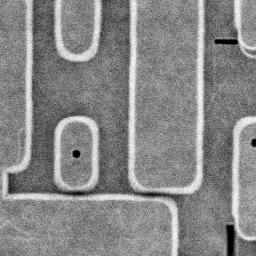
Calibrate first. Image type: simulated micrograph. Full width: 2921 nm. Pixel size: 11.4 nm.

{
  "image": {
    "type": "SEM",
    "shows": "wiring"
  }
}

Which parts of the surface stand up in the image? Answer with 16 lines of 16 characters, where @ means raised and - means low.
@@--@@--@@@@@--@
@@--@@--@@@@@--@
@@--@@--@@@@@--@
@@--@---@@@@@---
@@------@@@@----
@@------@@@@----
@@------@@@@@---
@@--@---@@@@@---
@@--@@--@@@@---@
@@--@@--@@@@---@
@---@@--@@@@---@
----@@--@@@@---@
@@@@@@@@@@-----@
@@@@@@@@@@@----@
@@@@@@@@@@@----@
@@@@@@@@@@@-----